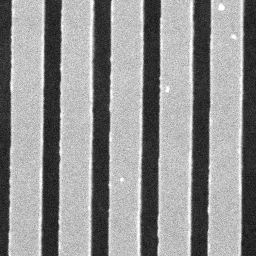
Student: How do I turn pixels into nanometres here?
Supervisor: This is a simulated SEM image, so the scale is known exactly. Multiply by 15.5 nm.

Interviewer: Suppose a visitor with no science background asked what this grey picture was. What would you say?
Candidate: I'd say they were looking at lines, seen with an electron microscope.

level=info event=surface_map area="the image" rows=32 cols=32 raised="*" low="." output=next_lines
..***...****..****..****..****..
..***...****..****..****..****..
..***...****..****..****..****..
.****...****..****..****..****..
.****...****..****..****..****..
.****...****..****..****..****..
.****...****..****..****..****..
.****...****..****..****..****..
.****...****..****..****..****..
.****...****..****..****..****..
.****...****..****..****..****..
.****...****..****..****..****..
.****...****..****..****..****..
.****...****..****..****..****..
.****...****..****..****..****..
.****...****..****..****..****..
.****...****..****..****..****..
.****...****..****..****..****..
.****...***...****..****..****..
.****...***...****..****..****..
.****...***...****..****..****..
.****...***...****..****..****..
.****...***...****..****..****..
.****...***...****..****..****..
.****...***...****..****..****..
.****..****...****..****..****..
.****..****...***...****..****..
.****..****...***...****..****..
.****..****...***...****..****..
.****..****...***...****..****..
.****..****...***...****..****..
.****..****...***...****..****..